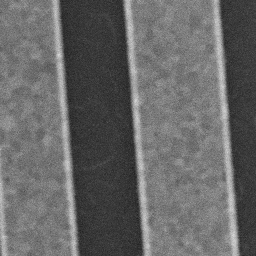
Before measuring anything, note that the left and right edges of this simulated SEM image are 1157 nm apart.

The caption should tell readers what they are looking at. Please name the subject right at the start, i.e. one or a few lines or trenches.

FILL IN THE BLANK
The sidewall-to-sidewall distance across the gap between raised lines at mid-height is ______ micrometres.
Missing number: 0.33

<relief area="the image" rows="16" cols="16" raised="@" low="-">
@@@-----@@@@@---
@@@@----@@@@@@--
@@@@----@@@@@@--
@@@@----@@@@@@--
@@@@----@@@@@@--
@@@@----@@@@@@--
@@@@----@@@@@@--
@@@@-----@@@@@--
@@@@-----@@@@@--
@@@@-----@@@@@--
@@@@-----@@@@@--
@@@@-----@@@@@--
@@@@-----@@@@@--
@@@@-----@@@@@--
@@@@@----@@@@@@-
@@@@@----@@@@@@-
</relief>